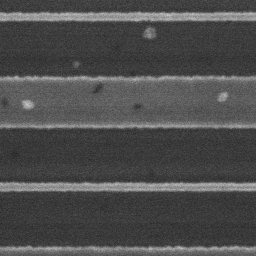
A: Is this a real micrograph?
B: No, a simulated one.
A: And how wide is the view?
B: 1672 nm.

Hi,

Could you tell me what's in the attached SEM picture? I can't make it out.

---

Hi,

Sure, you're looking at lines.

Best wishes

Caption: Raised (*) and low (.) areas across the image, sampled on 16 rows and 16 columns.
................
................
................
................
................
****************
****************
****************
................
................
................
................
................
................
................
******.*********